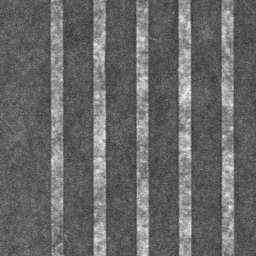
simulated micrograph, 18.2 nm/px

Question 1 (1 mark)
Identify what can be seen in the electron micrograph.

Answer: parallel lines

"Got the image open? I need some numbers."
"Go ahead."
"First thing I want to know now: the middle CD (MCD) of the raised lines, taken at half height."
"10.8 pixels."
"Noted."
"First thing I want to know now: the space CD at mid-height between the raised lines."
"574 nm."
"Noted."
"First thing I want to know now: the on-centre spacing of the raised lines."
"777 nm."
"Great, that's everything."